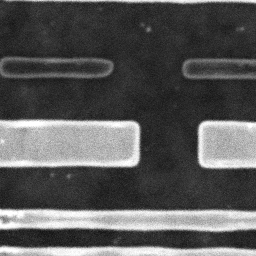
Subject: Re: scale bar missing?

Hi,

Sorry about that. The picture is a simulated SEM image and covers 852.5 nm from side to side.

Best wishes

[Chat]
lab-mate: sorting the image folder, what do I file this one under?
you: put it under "wiring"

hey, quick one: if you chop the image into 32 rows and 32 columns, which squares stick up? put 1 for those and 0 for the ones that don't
00000000000000000000000000000000
00000000000000000000000000000000
00000000000000000000000000000000
00000000000000000000000000000000
00000000000000000000000000000000
00000000000000000000000000000000
00000000000000000000000000000000
11111111111110000000000011111110
11111111111111000000000111111111
01111111111110000000000111111111
00000000000000000000000000000000
00000000000000000000000000000000
00000000000000000000000000000000
00000000000000000000000000000000
00000000000000000000000000000000
11111111111111111000000001111111
11001111111111111000000001111111
11111111111111111000000001111111
11111111111111111000000001111111
11111111111111111000000001111111
11111111111111111000000001111111
00000000000000000000000000000000
00000000000000000000000000000000
00000000000000000000000000000000
00000000000000000000000000000000
00000000000000000000000000000000
11111111101111111111111111111100
01111111111111111111111111111111
11100111000111111111111111111111
00000000000000000000000000000000
00000000000000000000000000000000
01111111111111111111111111111111